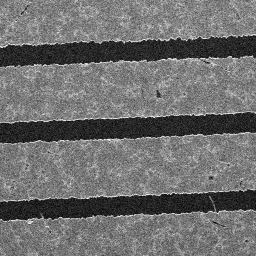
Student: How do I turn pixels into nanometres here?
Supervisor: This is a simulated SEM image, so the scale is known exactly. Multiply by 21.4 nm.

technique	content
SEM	one or a few lines or trenches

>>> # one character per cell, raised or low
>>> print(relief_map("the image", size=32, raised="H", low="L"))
HHHHHHHHHHHHHHHHHHHHHHHHHHHHHHHH
HHHHHHHHHHHHHHHHHHHHHHHHHHHHHHHH
HHHHHHHHHHHHHHHHHHHHHHHHHHHHHHHH
HHHHHHHHHHHHHHHHHHHHHHHHHHHHHHHH
HHHHHHHHHHHHHHHHHHHHHHHHHHHHHLLL
HHHLHLLLLLLLLLLLLLLLLLLLLLLLLLLL
LLLLLLLLLLLLLLLLLLLLLLLLLLLLLLLL
LLLLLLLLLLLLLLLLLLLLHHHHHHHHHHHH
HHHHHHHHHHHHHHHHHHHHHHHHHHHHHHHH
HHHHHHHHHHHHHHHHHHHHHHHHHHHHHHHH
HHHHHHHHHHHHHHHHHHHHHHHHHHHHHHHH
HHHHHHHHHHHHHHHHHHHLHHHHHHHHHHHH
HHHHHHHHHHHHHHHHHHHHHHHHHHHHHHHH
HHHHHHHHHHHHHHHHHHHHHHHHHHHHHHHH
HHHHHHHHHHHHHHHHHLHHLLLLLLLLLLLL
LLLLLLLLLLLLLLLLLLLLLLLLLLLLLLLL
LLLLLLLLLLLLLLLLLLLLLLLLLLLLLLLL
LLLLLLLLLLLLLLLHHHHHHHHHHHHHHHHH
HHHHHHHHHHHHHHHHHHHHHHHHHHHHHHHH
HHHHHHHHHHHHHHHHHHHHHHHHHHHHHHHH
HHHHHHHHHHHHHHHHHHHHHHHHHHHHHHHH
HHHHHHHHHHHHHHHHHHHHHHHHHHHHHHHH
HHHHHHHHHHHHHHHHHHHHHHHHHHLHHHHH
HHHHHHHHHHHHHHHHHHHHHHHHHHHHHHHH
HHHHHHHHHHHHLHHLLLLLLLLLLLLLLLLL
LLLLLLLLLLLLLLLLLLLLLLLLLLLLLLLL
LLLLLLLLLLLLLLLLLLLLLLLLLLHHHHHH
LLLLHHHHHHHHHHHHHHHHHHHHHHHHHHHH
HHHHHHHHHHHHHHHHHHHHHHHHHHHHHHHH
HHHHHHHHHHHHHHHHHHHHHHHHHHHHHHHH
HHHHHHHHHHHHHHHHHHHHHHHHHHHHHHHH
HHHHHHHHHHHHHHHHHHHHHHHHHHHHHHHH